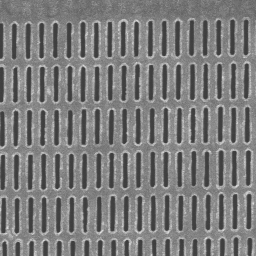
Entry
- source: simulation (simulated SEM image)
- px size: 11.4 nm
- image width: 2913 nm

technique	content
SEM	a regular array of holes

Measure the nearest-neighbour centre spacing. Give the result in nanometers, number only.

153